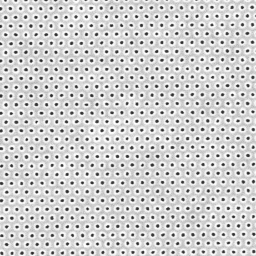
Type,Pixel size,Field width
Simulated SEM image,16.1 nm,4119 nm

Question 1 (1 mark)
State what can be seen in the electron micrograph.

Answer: a regular array of holes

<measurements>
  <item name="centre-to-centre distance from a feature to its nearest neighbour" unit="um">0.157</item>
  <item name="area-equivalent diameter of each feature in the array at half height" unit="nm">60.2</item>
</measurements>